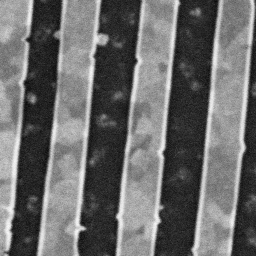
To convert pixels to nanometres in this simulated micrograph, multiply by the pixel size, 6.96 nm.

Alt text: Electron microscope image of one or a few lines or trenches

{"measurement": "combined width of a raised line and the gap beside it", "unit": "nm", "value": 538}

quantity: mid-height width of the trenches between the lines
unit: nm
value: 292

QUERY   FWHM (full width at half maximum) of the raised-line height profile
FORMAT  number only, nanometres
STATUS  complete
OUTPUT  238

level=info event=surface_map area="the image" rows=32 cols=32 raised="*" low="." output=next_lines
****....****......****......****
****....****......****.....*****
****....****......****.....*****
****....****......****.....****.
***.....****.....*****.....****.
***.....****.....*****.....****.
***....*****.....****......****.
***....*****.....****......****.
***....*****.....****......****.
***....****......****......****.
***....****......****......****.
***....****......****......****.
***....****......****.....*****.
***....****.....*****.....*****.
***....****.....*****.....****..
***....****.....*****.....****..
**.....****.....*****.....****..
**.....****.....****......****..
**....*****.....****......****..
**....*****.....****......****..
**....****......****......****..
**....****......****......****..
**....****.....*****.....*****..
**....****.....*****.....*****..
**....****.....*****.....****...
**....****.....*****.....****...
**...*****.....*****.....****...
*....*****.....*****.....****...
*....*****.....****......****...
*....*****.....****......****...
*....*****.....****.....*****...
*....*****.....****.....*****...